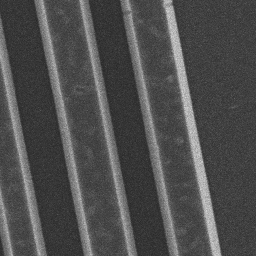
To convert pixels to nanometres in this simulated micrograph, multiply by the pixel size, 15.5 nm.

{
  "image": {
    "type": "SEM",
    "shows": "one or a few lines or trenches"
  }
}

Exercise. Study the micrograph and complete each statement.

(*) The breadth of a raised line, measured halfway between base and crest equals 668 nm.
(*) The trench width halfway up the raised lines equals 625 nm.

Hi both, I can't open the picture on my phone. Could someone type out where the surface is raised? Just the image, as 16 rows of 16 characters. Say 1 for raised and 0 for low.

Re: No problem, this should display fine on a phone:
0011100011100000
0001110011100000
0001110011100000
0001110011100000
0001110001100000
1001110001110000
1000110001110000
1000111001110000
1000111001110000
1000111000110000
1100111000111000
1100011000111000
1100011100111000
1100011100111000
1100011100011000
1110011100011000